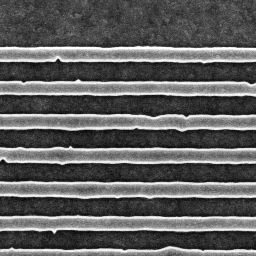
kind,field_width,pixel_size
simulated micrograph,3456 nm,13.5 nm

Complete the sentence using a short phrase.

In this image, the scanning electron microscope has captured parallel lines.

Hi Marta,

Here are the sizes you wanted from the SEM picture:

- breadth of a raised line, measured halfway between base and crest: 186 nm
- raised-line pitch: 456 nm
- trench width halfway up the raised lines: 267 nanometers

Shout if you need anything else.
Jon